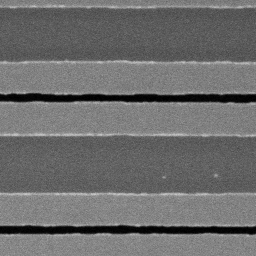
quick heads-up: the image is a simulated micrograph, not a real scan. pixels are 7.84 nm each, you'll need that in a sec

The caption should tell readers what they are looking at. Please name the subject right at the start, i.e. lines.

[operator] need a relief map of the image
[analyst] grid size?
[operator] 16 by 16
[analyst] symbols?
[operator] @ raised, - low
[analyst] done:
----------------
----------------
----------------
----------------
@@@@@@@@@@@@@@@@
@@@@@@@@@@@@@@@@
@@@@@@@@@@@@@@@@
@@@@@@@@@@@@@@@@
----------------
----------------
----------------
----------------
@@@@@@@@@@@@@@@@
@@@@@@@@@@@@@@@@
--@@@@@-@@@@@@@@
@@@@@@@@@@@@@@@@